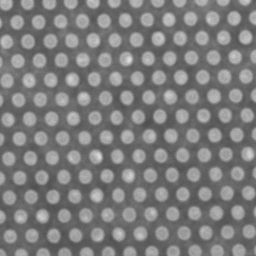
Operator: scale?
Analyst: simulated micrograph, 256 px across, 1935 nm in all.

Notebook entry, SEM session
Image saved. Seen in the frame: a regular array of raised bodies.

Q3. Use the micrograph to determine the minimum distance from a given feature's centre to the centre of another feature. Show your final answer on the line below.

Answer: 163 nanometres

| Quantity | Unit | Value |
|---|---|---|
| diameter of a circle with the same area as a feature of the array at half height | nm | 101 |